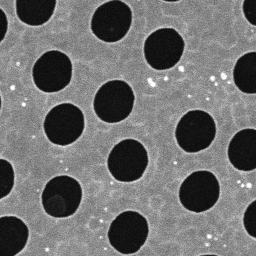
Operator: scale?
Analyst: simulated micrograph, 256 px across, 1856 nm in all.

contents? a regular array of holes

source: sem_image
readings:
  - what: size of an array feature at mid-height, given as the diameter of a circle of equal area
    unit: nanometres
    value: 302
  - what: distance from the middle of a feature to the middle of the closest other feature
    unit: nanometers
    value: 438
